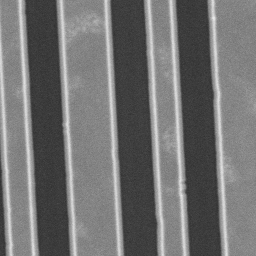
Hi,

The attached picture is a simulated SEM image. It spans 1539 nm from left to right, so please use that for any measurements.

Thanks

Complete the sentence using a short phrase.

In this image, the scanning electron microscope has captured one or a few lines or trenches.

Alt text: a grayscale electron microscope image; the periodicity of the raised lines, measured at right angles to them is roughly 0.456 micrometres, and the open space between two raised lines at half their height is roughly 227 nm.